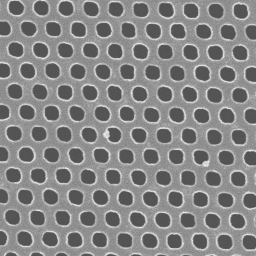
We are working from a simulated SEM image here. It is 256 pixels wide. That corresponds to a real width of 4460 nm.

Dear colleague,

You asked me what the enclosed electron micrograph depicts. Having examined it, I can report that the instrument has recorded a regular array of holes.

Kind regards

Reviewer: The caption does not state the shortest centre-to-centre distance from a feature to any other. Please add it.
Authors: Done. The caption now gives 421 nanometres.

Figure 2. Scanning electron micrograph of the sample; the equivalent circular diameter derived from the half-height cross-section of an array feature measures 263 nm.